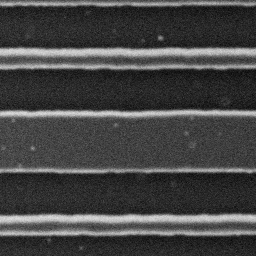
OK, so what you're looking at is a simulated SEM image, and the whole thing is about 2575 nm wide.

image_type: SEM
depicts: lines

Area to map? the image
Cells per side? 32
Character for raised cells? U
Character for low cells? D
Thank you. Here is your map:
UUUUUUUUUUUUUUUUUUUUUUUUUUUUUUUU
DDDDDDDDDDDDDDDDDDDDDDDDDDDDDDDD
DDDDDDDDDDDDDDDDDDDDDDDDDDDDDDDD
DDDDDDDDDDDDDDDDDDDDDDDDDDDDDDDD
DDDDDDDDDDDDDDDDDDDDDDDDDDDDDDDD
DDDDDDDDDDDDDDDDDDDDDDDDDDDDDDDD
UUUUUUUUUUUUUUUUUUUUUUUUUUUUUUUU
UUUUUUUUUUUUUUUUUUUUUUUUUUUUUUUU
UUDDDDDDDDUUUUUUUUUUDDDDUUDUUDDD
DDDDDDDDDDDDDDDDDDDDDDDDDDDDDDDD
DDDDDDDDDDDDDDDDDDDDDDDDDDDDDDDD
DDDDDDDDDDDDDDDDDDDDDDDDDDDDDDDD
DDDDDDDDDDDDDDDDDDDDDDDDDDDDDDDD
DDDDDDDDDDDDDDDDDDDDDDDDDDDDDDDD
UUUUUUUUUUUUUUUUUUUUUUUUUUUUUUUU
UUUUUUUUUUUUUUUUUUUUUUUUUUUUUUUU
UUUUUUUUUUUUUUUUUUUUUUUUUUUUUUUU
UUUUUUUUUUUUUUUUUUUUUUUUUUUUUUUU
UUUUUUUUUUUUUUUUUUUUUUUUUUUUUUUU
UUUUUUUUUUUUUUUUUUUUUUUUUUUUUUUU
UUUUUUUUUUUUUUUUUUUUUUUUUUUUUUUU
UDDDDDDUUUUUUUUUDDUDDDDDDDDDDDUU
DDDDDDDDDDDDDDDDDDDDDDDDDDDDDDDD
DDDDDDDDDDDDDDDDDDDDDDDDDDDDDDDD
DDDDDDDDDDDDDDDDDDDDDDDDDDDDDDDD
DDDDDDDDDDDDDDDDDDDDDDDDDDDDDDDD
DDDDDDDDDDDDDDDDDDDDDDDDDDDDDDDD
UUUUUUUUUUUUUUUUUUUUUUUUUUUUUUUU
UUUUUUUUUUUUUUUUUUUUUUUUUUUUUUUU
DDDDDDDDDDDDDDDDDDDDDDDDDDDDDDDD
DDDDDDDDDDDDDDDDDDDDDDDDDDDDDDDD
DDDDDDDDDDDDDDDDDDDDDDDDDDDDDDDD